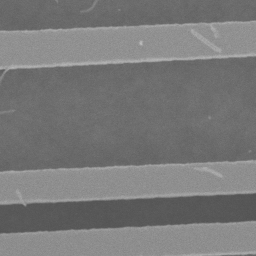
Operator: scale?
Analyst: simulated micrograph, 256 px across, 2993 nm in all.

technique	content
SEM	lines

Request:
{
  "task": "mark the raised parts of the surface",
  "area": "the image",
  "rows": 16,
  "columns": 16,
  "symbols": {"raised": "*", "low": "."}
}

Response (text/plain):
................
.............***
****************
****************
................
................
................
................
................
................
.....***********
****************
******..........
................
..**************
****************